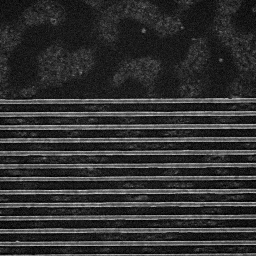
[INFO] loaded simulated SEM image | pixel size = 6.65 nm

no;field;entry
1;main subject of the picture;parallel lines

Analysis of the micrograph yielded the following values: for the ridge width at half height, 3.62 px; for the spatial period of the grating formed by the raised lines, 0.0859 um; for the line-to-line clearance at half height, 61.5 nm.